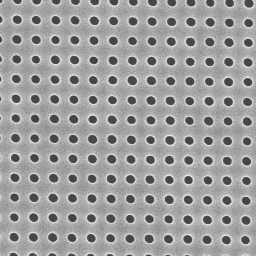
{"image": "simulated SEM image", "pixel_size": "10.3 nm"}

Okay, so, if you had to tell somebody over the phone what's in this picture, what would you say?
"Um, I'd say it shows a regular array of holes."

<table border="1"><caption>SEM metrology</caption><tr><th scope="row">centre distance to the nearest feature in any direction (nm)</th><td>196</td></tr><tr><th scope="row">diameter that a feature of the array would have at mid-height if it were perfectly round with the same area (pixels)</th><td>8.74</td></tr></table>